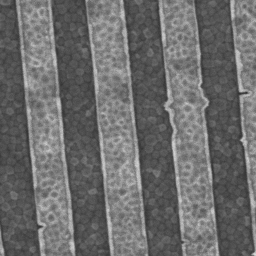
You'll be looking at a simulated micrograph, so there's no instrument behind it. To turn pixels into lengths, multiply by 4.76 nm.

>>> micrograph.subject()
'one or a few lines or trenches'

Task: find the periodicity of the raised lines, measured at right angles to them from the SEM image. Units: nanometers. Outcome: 337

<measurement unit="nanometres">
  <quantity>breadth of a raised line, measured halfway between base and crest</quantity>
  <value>166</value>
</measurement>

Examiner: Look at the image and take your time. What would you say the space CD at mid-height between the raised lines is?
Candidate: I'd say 170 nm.